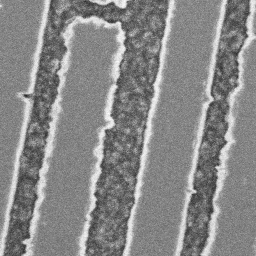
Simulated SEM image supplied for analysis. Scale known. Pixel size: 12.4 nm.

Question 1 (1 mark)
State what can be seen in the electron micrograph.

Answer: one or a few lines or trenches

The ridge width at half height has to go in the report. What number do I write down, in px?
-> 51.4